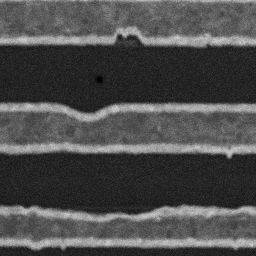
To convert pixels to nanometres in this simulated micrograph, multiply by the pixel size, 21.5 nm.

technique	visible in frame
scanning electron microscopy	one or a few lines or trenches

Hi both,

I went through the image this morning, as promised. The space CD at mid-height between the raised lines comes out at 1460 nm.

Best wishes